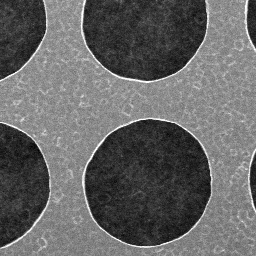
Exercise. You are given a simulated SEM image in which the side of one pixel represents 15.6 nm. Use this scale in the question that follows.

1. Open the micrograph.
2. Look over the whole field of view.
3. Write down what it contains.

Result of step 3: holes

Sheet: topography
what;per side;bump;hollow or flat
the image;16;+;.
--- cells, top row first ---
...++........++.
...++........++.
...++........+++
..++++......++++
.++++++....+++++
++++++++++++++++
++++++++++++++++
+++++++++.++++++
..+++++.....++++
...+++.......+++
...++........+++
...++........+++
...++........+++
...+++.......+++
..+++++.....++++
++++++++++++++++